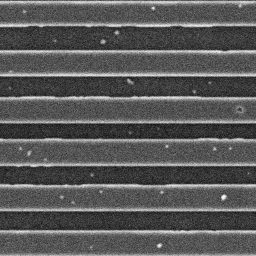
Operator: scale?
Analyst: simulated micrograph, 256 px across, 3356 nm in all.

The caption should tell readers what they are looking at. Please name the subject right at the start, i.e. lines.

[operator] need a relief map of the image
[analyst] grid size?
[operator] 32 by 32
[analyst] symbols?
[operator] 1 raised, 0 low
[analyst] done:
11111111111111111111111111111111
11111111111111111111111111111111
11111111111111111111111111111111
00000000000000000000000000000000
00000000000000000000000000000000
00000000000000000000000000000000
11111111111111111111111111111111
11111111111111111111111111111111
11111111111111111111111111111111
00000000000000000000000000000000
00000000000000000000000000000000
00000000000000000000000000000000
11111111111111111111111111111111
11111111111111111111111111111111
11111111111111111111111111111111
00000000000000000000000000000000
00000000000000000000000000000000
11111111111111111111111111111111
11111111111111111111111111111111
11111111111111111111111111111111
11111111111111111111111111111111
00000000000000000000000000000000
00000000000000000000000000000000
11111111111111111111111111111111
11111111111111111111111111111111
11111111111111111111111111111111
00000000000000000000000000000000
00000000000000000000000000000000
00000000000000000000000000000000
11111111111111111111111111111111
11111111111111111111111111111111
11111111111111111111111111111111